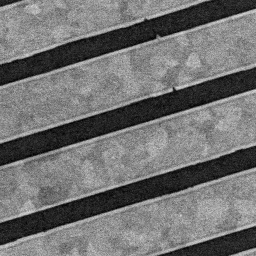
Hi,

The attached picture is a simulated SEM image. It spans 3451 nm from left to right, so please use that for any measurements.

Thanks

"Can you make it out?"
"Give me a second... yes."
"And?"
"one or a few lines or trenches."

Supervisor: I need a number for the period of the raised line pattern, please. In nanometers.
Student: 1030